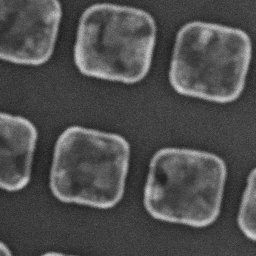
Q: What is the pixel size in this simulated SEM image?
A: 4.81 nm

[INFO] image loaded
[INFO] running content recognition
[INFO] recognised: raised bodies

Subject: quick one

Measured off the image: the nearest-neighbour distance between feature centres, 97.2 px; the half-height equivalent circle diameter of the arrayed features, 371 nanometers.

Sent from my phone